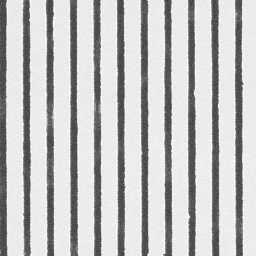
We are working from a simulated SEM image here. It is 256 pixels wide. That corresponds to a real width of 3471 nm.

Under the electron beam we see parallel lines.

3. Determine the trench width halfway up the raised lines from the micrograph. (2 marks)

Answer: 7.63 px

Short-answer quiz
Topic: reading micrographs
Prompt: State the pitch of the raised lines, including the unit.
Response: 320 nanometers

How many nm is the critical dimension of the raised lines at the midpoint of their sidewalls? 214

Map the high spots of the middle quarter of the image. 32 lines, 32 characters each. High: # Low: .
#..####..####..####..####..####.
#..####..####..####..####..####.
##.####..####..####..####..####.
#..####..####..####..####..####.
#..####..####..####..####..####.
#..####..####..####..####..####.
#..####..####..####..####..####.
#..####..####..####..####..####.
#..####..####..####..####..####.
#..####..####..####..####..####.
#..#####.####..####..####..####.
#..####.#####..####..####..####.
#..####..####..####..####..####.
#..####..####..####..####..####.
#..####..####..####..####..####.
#...###..####..####..####..####.
#...###...###..####..####..####.
#...###...###..####..####..####.
#...###...###..####..####..####.
#..####..####..####..####..####.
#...###..####..####..####..####.
#...###..####..####..####..####.
#...###..####..####..####..####.
#...###..####..####..####..####.
#...###..####..####..####..####.
#...###..####..####..####..####.
#...###..####..####..####..####.
#...###..####..####..####..####.
#...###...###..####..####..####.
#...###...###..####..####..####.
#...###..####..####..####..####.
#...###..####..####..####..####.